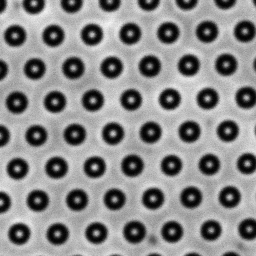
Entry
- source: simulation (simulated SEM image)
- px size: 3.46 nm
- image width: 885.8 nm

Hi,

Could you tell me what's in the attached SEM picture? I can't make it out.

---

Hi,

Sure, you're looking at a regular array of ring-shaped grooves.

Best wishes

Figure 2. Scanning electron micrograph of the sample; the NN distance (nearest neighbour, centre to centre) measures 131 nm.